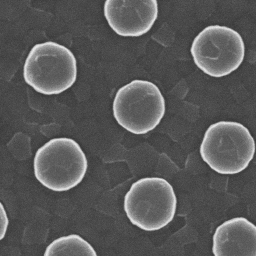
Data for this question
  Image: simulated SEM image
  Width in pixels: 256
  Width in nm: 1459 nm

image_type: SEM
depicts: raised bodies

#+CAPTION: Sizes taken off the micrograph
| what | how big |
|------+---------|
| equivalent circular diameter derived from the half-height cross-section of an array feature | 294 nanometers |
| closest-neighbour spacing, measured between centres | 551 nm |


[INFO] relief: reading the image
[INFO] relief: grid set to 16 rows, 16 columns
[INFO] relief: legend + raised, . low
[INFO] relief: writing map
.......+++......
.......++.......
............+++.
..+++.......+++.
..+++........+..
..++....++......
.......+++......
.......+++......
.............+++
..+++........+++
..+++........++.
...++....+......
........+++.....
........+++.....
..............++
...+++.......+++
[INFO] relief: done